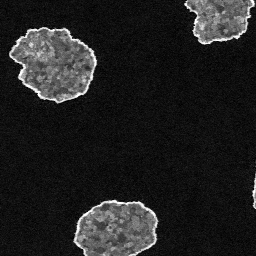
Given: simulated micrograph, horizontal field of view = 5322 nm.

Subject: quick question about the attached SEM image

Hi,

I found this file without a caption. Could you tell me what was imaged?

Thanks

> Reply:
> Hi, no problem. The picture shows raised bodies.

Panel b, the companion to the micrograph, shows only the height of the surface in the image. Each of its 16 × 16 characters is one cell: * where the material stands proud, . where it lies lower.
............****
............***.
.****........*..
.*****..........
.*****..........
..***...........
................
................
................
................
................
................
................
.....*****......
.....*****......
.....****.......